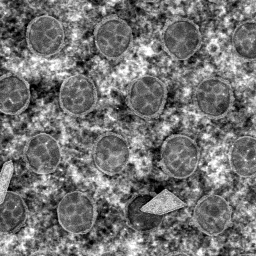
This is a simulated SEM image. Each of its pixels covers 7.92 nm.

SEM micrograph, a regular array of raised bodies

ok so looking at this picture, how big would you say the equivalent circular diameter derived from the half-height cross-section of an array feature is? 325 nm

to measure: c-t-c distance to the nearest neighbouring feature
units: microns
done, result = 0.528